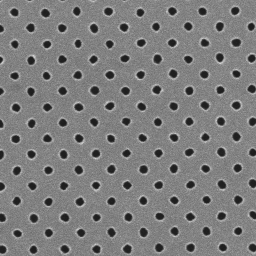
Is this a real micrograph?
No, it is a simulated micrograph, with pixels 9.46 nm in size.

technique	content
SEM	a regular array of holes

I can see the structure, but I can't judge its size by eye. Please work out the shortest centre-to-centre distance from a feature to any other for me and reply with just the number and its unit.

205 nanometers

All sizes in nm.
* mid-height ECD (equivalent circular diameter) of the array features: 76.3